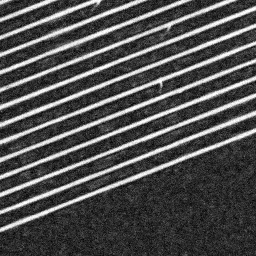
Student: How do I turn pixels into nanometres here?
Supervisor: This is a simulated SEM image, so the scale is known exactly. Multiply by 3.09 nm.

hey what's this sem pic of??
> parallel lines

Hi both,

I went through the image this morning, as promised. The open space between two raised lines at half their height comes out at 41.5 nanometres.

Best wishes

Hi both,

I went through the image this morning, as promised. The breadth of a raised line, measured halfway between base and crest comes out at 9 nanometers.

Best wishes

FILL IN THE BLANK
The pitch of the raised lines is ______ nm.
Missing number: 50.5